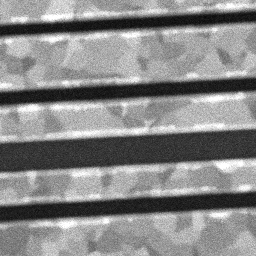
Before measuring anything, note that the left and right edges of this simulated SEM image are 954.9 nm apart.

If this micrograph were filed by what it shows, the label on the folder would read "one or a few lines or trenches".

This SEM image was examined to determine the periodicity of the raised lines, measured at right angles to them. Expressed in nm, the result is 234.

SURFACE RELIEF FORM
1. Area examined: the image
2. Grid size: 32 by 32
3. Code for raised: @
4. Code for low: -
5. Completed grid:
@@@@@@@@@@@@@@@@@@@@@@@@@@@@@@@@
@@@@@@@@@@@@@@@@@@@@@@@@@-------
@@@@@@@-------------------------
------------------------@@@@@@@@
------@@@@@@@@@@@@@@@@@@@@@@@@@@
@@@@@@@@@@@@@@@@@@@@@@@@@@@@@@@@
@@@@@@@@@@@@@@@@@@@@@@@@@@@@@@@@
@@@@@@@@@@@@@@@@@@@@@@@@@@@@@@@@
@@@@@@@@@@@@@@@@@@@@@@@@@@@@@@@@
@@@@@@@@@@@@@@@@@@@@@@@@@@@@@@--
@@@@@@@@@@@@--------------------
--------------------------------
-----------------@@@@@@@@@@@@@@@
@@@@@@@@@@@@@@@@@@@@@@@@@@@@@@@@
@@@@@@@@@@@@@@@@@@@@@@@@@@@@@@@@
@@@@@@@@@@@@@@@@@@@@@@@@@@@@@@@@
@@@@@@@@@@@@@@@@@@@-------------
@@------------------------------
--------------------------------
--------------------------------
--------------------------@@@@@@
--------@@@@@@@@@@@@@@@@@@@@@@@@
@@@@@@@@@@@@@@@@@@@@@@@@@@@@@@@@
@@@@@@@@@@@@@@@@@@@@@@@@@@@@@@@@
@@@@@@@@@@@@@@@@@---------------
--------------------------------
----------------------------@@@@
----------@@@@@@@@@@@@@@@@@@@@@@
@@@@@@@@@@@@@@@@@@@@@@@@@@@@@@@@
@@@@@@@@@@@@@@@@@@@@@@@@@@@@@@@@
@@@@@@@@@@@@@@@@@@@@@@@@@@@@@@@@
@@@@@@@@@@@@@@@@@@@@@@@@@@@@@@@@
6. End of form